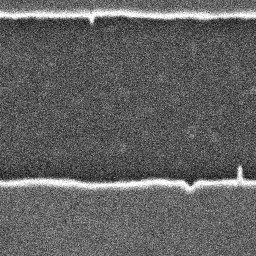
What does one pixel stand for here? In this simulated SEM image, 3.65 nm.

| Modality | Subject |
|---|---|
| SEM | one or a few lines or trenches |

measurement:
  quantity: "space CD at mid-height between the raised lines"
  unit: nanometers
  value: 607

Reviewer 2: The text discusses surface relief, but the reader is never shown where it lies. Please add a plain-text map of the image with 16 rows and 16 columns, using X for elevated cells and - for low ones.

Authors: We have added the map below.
XXXXXXXXXXXXXXXX
----------------
----------------
----------------
----------------
----------------
----------------
----------------
----------------
----------------
----------------
XXXXX---XXX-XXXX
XXXXXXXXXXXXXXXX
XXXXXXXXXXXXXXXX
XXXXXXXXXXXXXXXX
XXXXXXXXXXXXXXXX